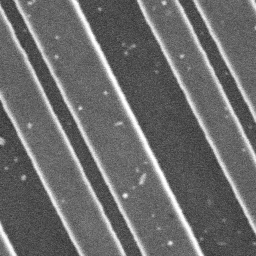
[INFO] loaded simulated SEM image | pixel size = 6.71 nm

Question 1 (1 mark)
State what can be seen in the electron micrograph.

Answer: lines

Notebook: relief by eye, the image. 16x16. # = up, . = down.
#####....#######
#####....#######
######....######
######....######
#######....#####
#######....#####
########....####
.#######....####
.########....###
..#######....###
..########....##
...#######....##
...########....#
....#######....#
....########....
#....#######....